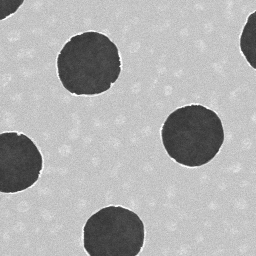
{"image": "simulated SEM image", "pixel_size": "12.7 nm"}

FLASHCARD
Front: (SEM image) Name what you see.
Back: holes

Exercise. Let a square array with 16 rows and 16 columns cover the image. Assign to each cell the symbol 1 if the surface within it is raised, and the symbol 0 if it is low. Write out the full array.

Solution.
0111111111111111
1111111111111110
1111000111111110
1111000111111110
1111000111111111
1111000111111111
1111111111111111
1111111111000011
0111111111000011
0011111111000011
0001111111111111
0011111111111111
1111111111111111
1111110001111111
1111100001111111
1111100001111111